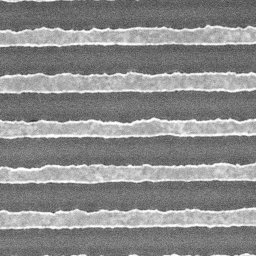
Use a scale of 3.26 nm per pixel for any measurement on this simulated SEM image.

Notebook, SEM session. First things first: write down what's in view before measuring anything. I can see lines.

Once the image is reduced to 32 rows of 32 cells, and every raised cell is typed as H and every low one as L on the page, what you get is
LLLLLLLLLLLLLLLLLLLLLLLLLLLLLLLL
LLLLLLLLLLLLLLLLLLLLLLLLLLLLLLLL
LLLLLLLLLLLLLLLLLLLLLLLLLLLLLLLL
LLLLLLLLLLLLLLLLLHLLHLLLLHHHLLLH
HHHHHHHHHHHHHHHHHHHHHHHHHHHHHHHH
HHHHHHHHHHHHHHHHHHHHHLLHHHHHHHLL
LLLLLLLLLLLLLLLLLLLLLLLLLLLLLLLL
LLLLLLLLLLLLLLLLLLLLLLLLLLLLLLLL
LLLLLLLLLLLLLLLLLLLLLLLLLLLLLLLL
LHHHHHHHHHHHHHHHHHHHHHHHHHHHHHHH
HHHHHHHHHHHHHHHHHHHHHHHHHHHHHHHH
HHHLHHHHLHHHLLLLLLLLLLLLLLLLLLLL
LLLLLLLLLLLLLLLLLLLLLLLLLLLLLLLL
LLLLLLLLLLLLLLLLLLLLLLLLLLLLLLLL
LLLLLLLLLLLLLLLLLLLLLLLLLLLLLLLL
HHHHHHHHHHHHHHHHHHHHHHHHHHHHHHHH
HHHHHHHHHHHHHHHHHHHHHHHHHHHHHHHH
LLLLLLLLLLLLLLLLLLLLLLLLLLLLLLLL
LLLLLLLLLLLLLLLLLLLLLLLLLLLLLLLL
LLLLLLLLLLLLLLLLLLLLLLLLLLLLLLLL
LLLLLLLLLLLLLLLLLLLLLLLLLLLHHLLH
HHHHHHHHHHHHHHHHHHHHHHHHHHHHHHHH
HHHHHHHHHHHHHHHHHHHHHHHHHHHHHHHH
LLLLLLLLLLLLLLLLLLLLLLLLLLLLLLLL
LLLLLLLLLLLLLLLLLLLLLLLLLLLLLLLL
LLLLLLLLLLLLLLLLLLLLLLLLLLLLLLLL
HLHHLLLHHHHLHHHLHHHHHHHHHHHHHHHH
HHHHHHHHHHHHHHHHHHHHHHHHHHHHHHHH
HHHHLHHHHLLLLLLLLLLLLLLLLLLLLLLL
LLLLLLLLLLLLLLLLLLLLLLLLLLLLLLLL
LLLLLLLLLLLLLLLLLLLLLLLLLLLLLLLL
LLLLLLLLLLLLLLLLLLLLLLLLLLLLLLLL